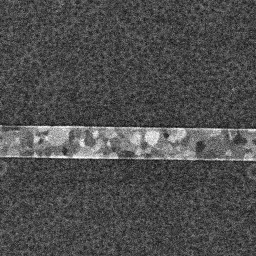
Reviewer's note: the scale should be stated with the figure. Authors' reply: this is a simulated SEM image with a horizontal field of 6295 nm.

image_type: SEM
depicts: one or a few lines or trenches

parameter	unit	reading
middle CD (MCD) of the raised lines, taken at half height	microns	0.747